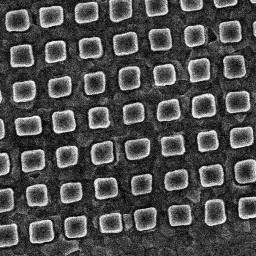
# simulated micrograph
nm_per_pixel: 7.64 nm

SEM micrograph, a regular array of raised bodies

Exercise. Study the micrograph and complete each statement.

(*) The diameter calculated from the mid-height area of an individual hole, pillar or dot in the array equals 179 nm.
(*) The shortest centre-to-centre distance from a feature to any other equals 265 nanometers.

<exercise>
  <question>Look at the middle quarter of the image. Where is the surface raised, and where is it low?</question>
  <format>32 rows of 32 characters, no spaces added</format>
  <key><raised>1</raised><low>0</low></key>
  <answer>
00000000000000000000000011100001
00000000000000111110001111110001
00000001110000111110001111110001
10000111110000111110000111110000
11000111110000111110000111110000
11000111110000111110000000000000
11000111110000000000000000000000
10000010000000000000000000000000
00000000000000000000000000000000
00000000000000000000000011110000
00000000000000011111000011111000
00000011111000011111000111111000
11000011111000011111000111111000
11000011111000011111000111111000
11100011111000011010000000000000
11100011111000000000000000000000
11000000000000000000000000000000
00000000000000000000000000000000
00000000000000000000000001111000
00000000001100001111100011111100
01000001111100011111100001111100
11100001111100011111100001111100
11100001111100001111100001111000
11100001111100001110000000000000
11100001111000000000000000000000
10000000000000000000000000000000
00000000000000000000000000001100
00000000000000000000000000111110
00000000000100000111110001111110
00000000111110000111110001111110
11110000111110000111110001111110
11111000111110000111110000100000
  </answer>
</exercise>